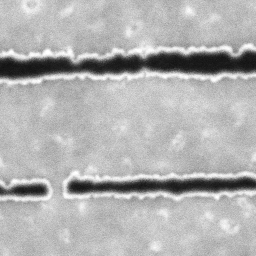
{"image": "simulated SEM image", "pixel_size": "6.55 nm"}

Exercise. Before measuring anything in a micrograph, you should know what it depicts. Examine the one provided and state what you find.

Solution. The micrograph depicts one or a few lines or trenches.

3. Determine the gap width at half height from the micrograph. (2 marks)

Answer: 648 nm